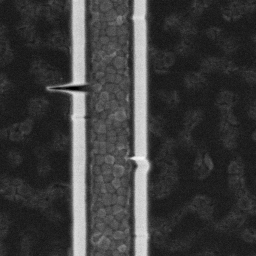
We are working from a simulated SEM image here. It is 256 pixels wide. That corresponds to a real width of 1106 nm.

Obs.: one or a few lines or trenches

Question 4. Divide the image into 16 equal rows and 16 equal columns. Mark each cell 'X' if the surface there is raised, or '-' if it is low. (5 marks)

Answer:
XXXXX----XXXXXXX
XXXXX----XXXXXXX
XXXXX----XXXXXXX
XXXXX----XXXXXXX
XXXXX----XXXXXXX
XXXXX----XXXXXXX
XXXXX----XXXXXXX
XXXXX----XXXXXXX
XXXXX----XXXXXXX
XXXXX----XXXXXXX
XXXXX----XXXXXXX
XXXXX----XXXXXXX
XXXXX----XXXXXXX
XXXXX----XXXXXXX
XXXXX----XXXXXXX
XXXXX----XXXXXXX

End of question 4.